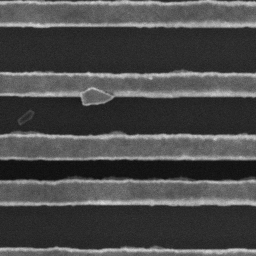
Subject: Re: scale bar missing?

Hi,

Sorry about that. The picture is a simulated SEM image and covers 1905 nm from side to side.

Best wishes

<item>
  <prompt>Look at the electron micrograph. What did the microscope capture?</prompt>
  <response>lines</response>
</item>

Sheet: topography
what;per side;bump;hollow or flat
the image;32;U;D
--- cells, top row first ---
UUUUUUUUUUUUUUUUUUUUUUUUUUUUUUUU
UUUUUUUUUUUUUUUUUUUUUUUUUUUUUUUU
UUUUUUUUUUUUUUUUUUUUUUUUUUUUUUUU
DDDDDDDDDDDDDDDDDDDDDDDDDDDDDDDD
DDDDDDDDDDDDDDDDDDDDDDDDDDDDDDDD
DDDDDDDDDDDDDDDDDDDDDDDDDDDDDDDD
DDDDDDDDDDDDDDDDDDDDDDDDDDDDDDDD
DDDDDDDDDDDDDDDDDDDDDDDDDDDDDDDD
DDDDDDDDDDDDDDDDDDDDDDDDDDDDDDDD
UUUUUUUUUUUUUUUUUUUUUUUUUUUUUUUU
UUUUUUUUUUUUUUUUUUUUUUUUUUUUUUUU
UUUUUUUUUUUUUUUUUUUUUUUUUUUUUUUU
DDDDDDDDDDUUUUDDDDDDDDDDDDDDDDDD
DDDDDDDDDDDDDDDDDDDDDDDDDDDDDDDD
DDDDDDDDDDDDDDDDDDDDDDDDDDDDDDDD
DDDDDDDDDDDDDDDDDDDDDDDDDDDDDDDD
DDDDDDDDDDDDDDDDDDDDDDDDDDDDDDDD
UUUUUUUUUUUUUUUUUUUUUUUUUUUUUUUU
UUUUUUUUUUUUUUUUUUUUUUUUUUUUUUUU
UUUUUUUUUUUUUUUUUUUUUUUUUUUUUUUU
DDDDDDDDDDDDDDDDDDDDDDDDDDDDDDDD
DDDDDDDDDDDDDDDDDDDDDDDDDDDDDDDD
DDUUUDDUUUUUUUUUUDDUUUDDDDDDDDDU
UUUUUUUUUUUUUUUUUUUUUUUUUUUUUUUU
UUUUUUUUUUUUUUUUUUUUUUUUUUUUUUUU
UUUUUUUUUUUUUUUUUUUUUUUUUUUUUUUU
DDDDDDDDDDDDDDDDDDDDDDDDDDDDDDDD
DDDDDDDDDDDDDDDDDDDDDDDDDDDDDDDD
DDDDDDDDDDDDDDDDDDDDDDDDDDDDDDDD
DDDDDDDDDDDDDDDDDDDDDDDDDDDDDDDD
DDDDDDDDDDDDDDDDDDDDDDDDDDDDDDDD
UUUUUUUUUUUUUUUUUUUUUUUUUUUUUUUU